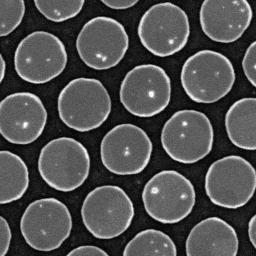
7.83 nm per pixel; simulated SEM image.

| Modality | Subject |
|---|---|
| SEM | a regular array of raised bodies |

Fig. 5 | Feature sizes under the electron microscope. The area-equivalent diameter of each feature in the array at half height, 400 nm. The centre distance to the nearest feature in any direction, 0.491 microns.